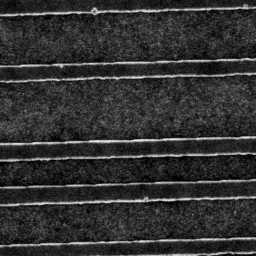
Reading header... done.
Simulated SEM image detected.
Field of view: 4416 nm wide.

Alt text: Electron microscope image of lines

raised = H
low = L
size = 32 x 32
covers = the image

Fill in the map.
HHHHHHHHHHHHHHHHHHHHHHHHHHHHHHHH
HHHHHHHHHHHHHLLLLLLLLLLLLLLLLLLL
LLLLLLLLLLLLLLLLLLLLLLLLLLLLLLLL
LLLLLLLLLLLLLLLLLLLLLLLLLLLLLLLL
LLLLLLLLLLLLLLLLLLLLLLLLLLLLLLLL
LLLLLLLLLLLLLLLLLLLLLLLLLLLLLLLL
LLLLLLLLLLLLLLLLLLLLLLLLLLLLLLLL
LLLLLLLLLLLLLLLLLLLLLLLLLLLHHHHH
HHHHHHHHHHHHHHHHHHHHHHHHHHHHHHHH
HHHHHHHHHHHHHHHHHHHHHHLLLLLLLLLL
LLLLLLLLLLLLLLLLLLLLLLLLLLLLLLLL
LLLLLLLLLLLLLLLLLLLLLLLLLLLLLLLL
LLLLLLLLLLLLLLLLLLLLLLLLLLLLLLLL
LLLLLLLLLLLLLLLLLLLLLLLLLLLLLLLL
LLLLLLLLLLLLLLLLLLLLLLLLLLLLLLLL
LLLLLLLLLLLLLLLLLLLLLLLLLLLLLLLL
LLLLLLLLLLLLLLLLLLLLLLLLLLLLLLLL
LLLLLLLLLLLLLLLLLLLLHHHHHHHHHHHH
HHHHHHHHHHHHHHHHHHHHHHHHHHHHHHHH
HHHHHHHHHHHHHHHHHHHHHHHLLLLLLLLL
LLLLLLLLLLLLLLLLLLLLLLLLLLLLLLLL
LLLLLLLLLLLLLLLLLLLLLLLLLLLLLLLL
LLLLLLLLLLLLLLLLLLLLLLLLLLLLLLLH
HHHHHHHHHHHHHHHHHHHHHHHHHHHHHHHH
HHHHHHHHHHHHHHHHHHHHHHHHHHHHHHHH
HHHHHHLLLLLLLLLLLLLLLLLLLLLLLLLL
LLLLLLLLLLLLLLLLLLLLLLLLLLLLLLLL
LLLLLLLLLLLLLLLLLLLLLLLLLLLLLLLL
LLLLLLLLLLLLLLLLLLLLLLLLLLLLLLLL
LLLLLLLLLLLLLLLLLLLLLLLLLLLLLLLL
LLLLLHHHHHHHHHHHHHHHHHHHHHHHHHHH
HHHHHHHHHHHHHHHHHHHHHHHHHHHHHHHH